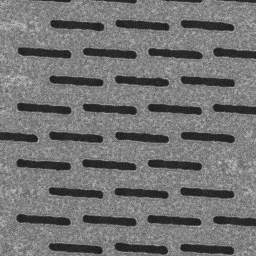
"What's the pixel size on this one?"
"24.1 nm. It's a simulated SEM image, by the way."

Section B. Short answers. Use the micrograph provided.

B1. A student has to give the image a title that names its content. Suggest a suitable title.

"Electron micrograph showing a regular array of holes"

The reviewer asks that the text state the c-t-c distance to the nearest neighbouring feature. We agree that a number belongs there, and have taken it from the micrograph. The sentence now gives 1020 nm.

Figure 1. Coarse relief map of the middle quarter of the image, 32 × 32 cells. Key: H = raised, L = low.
HHHHHHHHHHHHHHHHHHHHHHHHHHHHHHHH
HHHHHHHHHHHHHHHHHHHHHHHHHHHHHHHH
HHHHHHHHHHHHHHHHHHHHHHHHHHHHHHHH
LLLLLLLLHHHHHLLLLLLLLLLLHHHHHLLL
LLLLLLLLLLHHHLLLLLLLLLLLLLHHHLLL
HHHLLLLLLLHHHHHHHHHHLLLLLLHHHHHH
HHHHHHHHHHHHHHHHHHHHHHHHHHHHHHHH
HHHHHHHHHHHHHHHHHHHHHHHHHHHHHHHH
HHHHHHHHHHHHHHHHHHHHHHHHHHHHHHHH
HHHHHHHHHHHHHHHHHHHHHHHHHHHHHHHH
LHHHHLLLLLLLLLLLHHHHHLLLLLLLLLHL
LLHHHLLLLLLLLLLLLLHHHLLLLLLLLLLL
LHHHHHHHHHHHHHLLLLHHHHHHHHHHHHLL
HHHHHHHHHHHHHHHHHHHHHHHHHHHHHHHH
HHHHHHHHHHHHHHHHHHHHHHHHHHHHHHHH
HHHHHHHHHHHHHHHHHHHHHHHHHHHHHHHH
HHHHHHHHHHHHHHHHHHHHHHHHHHHHHHHH
LLLLLLLHHHHHHLLLLLLLLLLLHHHHHLLL
LLLLLLLLLLHHHLLLLLLLLLLLLLHHHLLL
HHHLLLLLLLHHHHHHHHHHLLLLLLHHHHHH
HHHHHHHHHHHHHHHHHHHHHHHHHHHHHHHH
HHHHHHHHHHHHHHHHHHHHHHHHHHHHHHHH
HHHHHHHHHHHHHHHHHHHHHHHHHHHHHHHH
HHHHHHHHHHHHHHHHHHHHHHHHHHHHHHHH
HHHHHLLLLLLLLLLLHHHHHLLLLLLLLLLL
LLHHHLLLLLLLLLLLLLHHHLLLLLLLLLLL
LHHHHHHHHHHLLLLLLLHHHHHHHHHHHHLL
HHHHHHHHHHHHHHHHHHHHHHHHHHHHHHHH
HHHHHHHHHHHHHHHHHHHHHHHHHHHHHHHH
HHHHHHHHHHHHHHHHHHHHHHHHHHHHHHHH
HHHHHHHHHHHHHHHHHHHHHHHHHHHHHHHH
LLLLLLLLLHHHHLLLLLLLLLLHHHHHHLLL